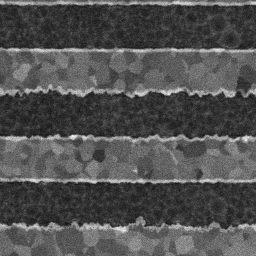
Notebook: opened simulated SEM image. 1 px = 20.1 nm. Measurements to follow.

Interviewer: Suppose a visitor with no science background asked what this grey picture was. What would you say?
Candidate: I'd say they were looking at one or a few lines or trenches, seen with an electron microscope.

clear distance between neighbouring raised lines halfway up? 0.915 micrometres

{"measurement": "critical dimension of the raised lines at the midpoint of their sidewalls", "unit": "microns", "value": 0.86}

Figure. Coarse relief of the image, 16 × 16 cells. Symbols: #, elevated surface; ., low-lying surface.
................
................
................
################
################
################
................
................
................
################
################
................
................
................
################
################